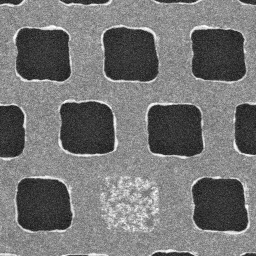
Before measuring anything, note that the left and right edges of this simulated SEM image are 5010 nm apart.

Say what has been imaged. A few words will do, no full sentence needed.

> holes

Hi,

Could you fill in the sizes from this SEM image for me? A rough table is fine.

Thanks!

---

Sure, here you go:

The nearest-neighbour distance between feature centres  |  1690 nm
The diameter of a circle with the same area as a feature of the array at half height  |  1150 nm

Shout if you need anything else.